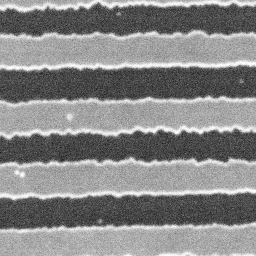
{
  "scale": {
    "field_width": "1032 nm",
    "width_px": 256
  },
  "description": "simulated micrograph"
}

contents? lines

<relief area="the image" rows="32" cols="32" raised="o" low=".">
oooooooooooo.oooo.ooooooo..oo.oo
................................
................................
................................
o.o..ooo.ooooo..oooooooooooo.ooo
oooooooooooooooooooooooooooooooo
oooooooooooooooooooooooooooooooo
oooooooooooooooooooooooooooooooo
.oooo.o....o.o..................
................................
................................
................................
...........o......o.....oooooooo
oooooooooooooooooooooooooooooooo
oooooooooooooooooooooooooooooooo
oooooooooooooooooooooooooooooooo
oooooooooo.oooooo...............
................................
................................
................................
.o..o.oooooooooooooooooooooooooo
oooooooooooooooooooooooooooooooo
oooooooooooooooooooooooooooooooo
oooooooooooooooooooooooooooooooo
ooooooooooo.....................
................................
................................
................................
...........o.ooooooooooooooooooo
oooooooooooooooooooooooooooooooo
oooooooooooooooooooooooooooooooo
oooooooooooooooooooooooooooooooo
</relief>